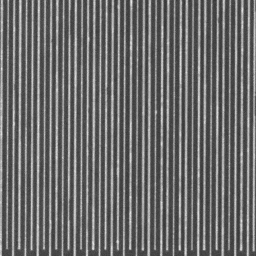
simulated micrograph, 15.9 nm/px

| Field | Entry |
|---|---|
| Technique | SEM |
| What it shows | parallel lines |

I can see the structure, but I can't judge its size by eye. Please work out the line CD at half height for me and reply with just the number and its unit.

15.9 nanometres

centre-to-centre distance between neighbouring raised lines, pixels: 6.16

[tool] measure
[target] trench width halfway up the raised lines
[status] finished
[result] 77.5 nanometres